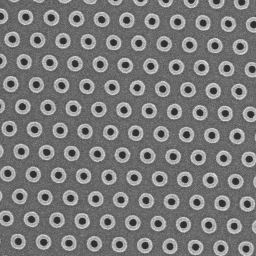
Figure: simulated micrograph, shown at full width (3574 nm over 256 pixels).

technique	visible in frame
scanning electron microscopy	a regular array of ring-shaped raised bodies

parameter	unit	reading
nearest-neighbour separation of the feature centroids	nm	349